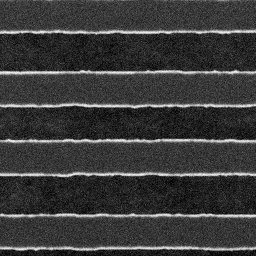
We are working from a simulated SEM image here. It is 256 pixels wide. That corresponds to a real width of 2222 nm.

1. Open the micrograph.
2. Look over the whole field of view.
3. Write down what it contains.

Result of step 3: lines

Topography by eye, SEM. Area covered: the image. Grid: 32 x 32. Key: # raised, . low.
################################
################################
################################
################################
................................
................................
................................
................................
................................
################################
################################
################################
################################
................................
................................
................................
................................
........#.######...#######..##..
################################
################################
################################
################################
................................
................................
................................
................................
................................
################################
################################
################################
################################
................................